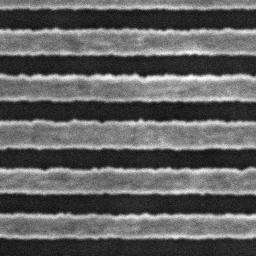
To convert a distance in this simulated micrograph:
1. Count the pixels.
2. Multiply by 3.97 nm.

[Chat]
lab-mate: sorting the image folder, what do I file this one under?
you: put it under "lines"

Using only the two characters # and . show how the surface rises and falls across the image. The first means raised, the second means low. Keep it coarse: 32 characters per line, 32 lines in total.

################################
................................
................................
................................
################################
################################
################################
................................
................................
###.#.########.##...##.##.#.###.
################################
################################
################################
................................
................................
################################
################################
################################
#....#.#...##.#.###..#####..##..
................................
................................
################################
################################
################################
................................
................................
................................
################################
################################
################################
................................
................................